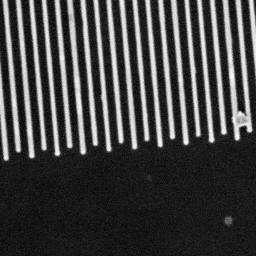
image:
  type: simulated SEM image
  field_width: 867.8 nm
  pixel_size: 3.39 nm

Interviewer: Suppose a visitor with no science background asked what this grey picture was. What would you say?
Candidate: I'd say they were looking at parallel lines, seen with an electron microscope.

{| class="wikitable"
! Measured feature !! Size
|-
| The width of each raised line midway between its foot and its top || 3.98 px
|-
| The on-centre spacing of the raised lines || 43.8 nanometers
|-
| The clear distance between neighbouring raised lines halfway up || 29.6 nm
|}